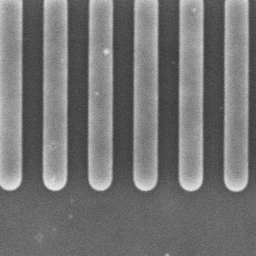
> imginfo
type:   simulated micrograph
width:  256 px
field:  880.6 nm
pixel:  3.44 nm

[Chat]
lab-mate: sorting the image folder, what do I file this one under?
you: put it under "groups of lines, slits or small figures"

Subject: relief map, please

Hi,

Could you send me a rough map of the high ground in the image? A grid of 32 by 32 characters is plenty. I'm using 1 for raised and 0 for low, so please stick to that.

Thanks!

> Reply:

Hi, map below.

11100011000111000111000110001110
11100011000111000111000110001110
11100011000111000111000110001110
11100011000111000111000110001110
11100011000111000111000110001110
11100011000111000111000110001110
11100011000111000111000110001110
11100011000111000111000110001110
11100011000111000111000110001110
11100011000111000111000110001110
11100011000111000111000110001110
11100011000111000111000110001110
11100011000111000111000110001110
11100011000111000111001110001110
11100011000111000111001110001110
11100111000111000111001110001110
11100111000111000111001110001110
11100111000111000111001110001110
11100111000111000111001110001110
11100111000111000111001110001110
11100111000111000111001110001110
11100111000111000111001110001110
11100111000111000111001110001110
11000011000010000110000110000100
00000000000000000000000000000000
00000000000000000000000000000000
00000000000000000000000000000000
00000000000000000000000000000000
00000000000000000000000000000000
00000000000000000000000000000000
00000000000000000000000000000000
00000000000000000000000000000000